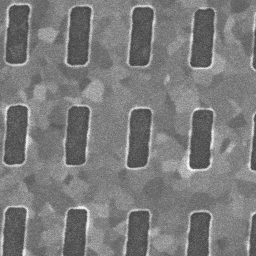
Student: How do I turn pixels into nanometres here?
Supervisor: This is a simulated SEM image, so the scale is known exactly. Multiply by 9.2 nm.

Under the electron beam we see a regular array of holes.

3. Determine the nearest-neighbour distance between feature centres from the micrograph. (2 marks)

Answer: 567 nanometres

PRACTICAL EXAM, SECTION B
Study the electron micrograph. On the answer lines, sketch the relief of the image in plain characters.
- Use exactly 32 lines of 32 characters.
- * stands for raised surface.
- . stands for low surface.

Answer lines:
********************************
*...*****..******..*****...*****
*...*****..*****...*****...*****
*...*****..*****...*****...*****
*...*****..*****...*****...*****
*..*****...*****...*****...*****
*..*****...*****...*****...*****
*..*****...*****...*****...*****
*************************.******
********************************
********************************
********************************
********************************
*..******..******.**************
*...****...*****...*****...*****
*...****...*****...*****...*****
*..*****...*****...*****...*****
*..*****...*****...*****...*****
...*****...*****...*****..*****.
...*****...*****...*****..*****.
*..*****..******..******..*****.
********************************
********************************
********************************
********************************
********************************
*..******..******..******.******
*..*****...*****...*****..*****.
...*****...*****...*****..*****.
...*****...*****...****...*****.
...*****...*****...****...*****.
...*****...*****..*****...*****.